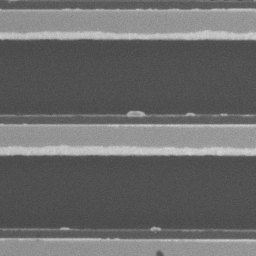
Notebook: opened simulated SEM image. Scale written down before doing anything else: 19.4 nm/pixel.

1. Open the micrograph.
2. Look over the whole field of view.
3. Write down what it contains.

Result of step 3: lines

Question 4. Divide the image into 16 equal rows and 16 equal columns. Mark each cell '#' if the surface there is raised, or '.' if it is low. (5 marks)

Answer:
################
################
................
................
................
................
................
################
################
################
................
................
................
................
################
################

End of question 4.